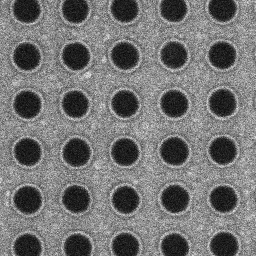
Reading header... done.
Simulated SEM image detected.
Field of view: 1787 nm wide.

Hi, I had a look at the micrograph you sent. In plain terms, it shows a regular array of raised bodies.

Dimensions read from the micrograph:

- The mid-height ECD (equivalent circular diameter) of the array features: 221 nm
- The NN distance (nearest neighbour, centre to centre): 334 nm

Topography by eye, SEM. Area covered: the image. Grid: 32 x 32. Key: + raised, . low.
.++++...+++...+++...++++..++++..
.++++...+++...+++...++++..++++..
..+++...+++...+++...+++....++...
................................
................................
..++....+++...+++...+++...+++...
.++++...+++...++++..++++..++++..
.++++...+++...++++..++++..++++..
..+++...+++...+++....++....++...
................................
................................
..+++...++....+++...+++...+++...
..+++...+++...+++...++++..++++..
..+++...+++...++++..++++..++++..
..+++...+++....++....++....++...
................................
................................
..+++...+++...+++...+++...+++...
..+++...+++...++++..++++..++++..
..+++...++++..++++..++++..++++..
..+++...+++...+++....++....++...
................................
................................
..+++...+++...+++...+++....++...
..+++...+++...++++..++++..++++..
..+++...+++...++++..++++..++++..
..+++...+++....++....++....++...
................................
................................
..+++...+++...+++...+++....+++..
..+++...++++..++++..++++..++++..
..+++...++++..++++..++++..++++..